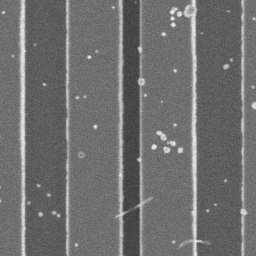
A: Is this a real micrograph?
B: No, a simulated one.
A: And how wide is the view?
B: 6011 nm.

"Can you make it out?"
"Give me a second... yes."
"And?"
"lines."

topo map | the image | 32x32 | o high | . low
ooo.....ooooooo...oooooo......oo
ooo.....ooooooo...oooooo......oo
ooo.....ooooooo...oooooo......oo
ooo.....ooooooo...oooooo......oo
ooo.....ooooooo...oooooo......oo
ooo.....ooooooo..ooooooo......oo
ooo.....ooooooo..ooooooo......oo
ooo.....ooooooo...oooooo......oo
ooo.....ooooooo...oooooo......oo
ooo.....ooooooo..ooooooo......oo
ooo.....ooooooo..ooooooo......oo
ooo.....ooooooo...oooooo......oo
ooo.....ooooooo...oooooo......oo
ooo.....ooooooo...oooooo......oo
ooo.....ooooooo...oooooo......oo
ooo.....ooooooo...oooooo......oo
ooo.....ooooooo...oooooo......oo
ooo.....ooooooo...oooooo......oo
ooo.....ooooooo...oooooo......oo
ooo.....ooooooo..ooooooo......oo
ooo.....ooooooo..ooooooo......oo
ooo.....ooooooo...oooooo......oo
ooo.....ooooooo...oooooo......oo
ooo.....ooooooo...oooooo......oo
ooo.....ooooooo...oooooo......oo
ooo.....ooooooo..ooooooo......oo
ooo.....ooooooo...oooooo......oo
ooo.....ooooooo...oooooo......oo
ooo.....ooooooo...oooooo......oo
ooo.....ooooooo...oooooo......oo
ooo.....ooooooo...ooooooo.....oo
ooo.....ooooooo...oooooo......oo